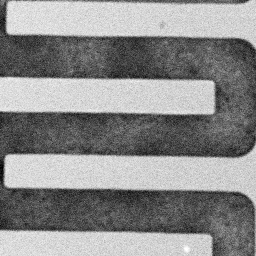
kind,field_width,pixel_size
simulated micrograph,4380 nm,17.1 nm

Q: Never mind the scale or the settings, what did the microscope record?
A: groups of lines, slits or small figures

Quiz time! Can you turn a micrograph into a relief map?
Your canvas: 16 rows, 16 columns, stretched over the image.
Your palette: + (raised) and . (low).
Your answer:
++++++++++++++++
++++++++++++++++
...............+
................
................
+++++++++++++...
+++++++++++++...
................
................
................
++++++++++++++++
++++++++++++++++
................
................
+++.............
+++++++++++++...